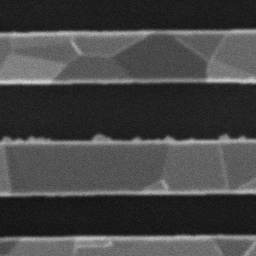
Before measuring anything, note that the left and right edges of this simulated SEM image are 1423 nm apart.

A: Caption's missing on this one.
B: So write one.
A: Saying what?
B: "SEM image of lines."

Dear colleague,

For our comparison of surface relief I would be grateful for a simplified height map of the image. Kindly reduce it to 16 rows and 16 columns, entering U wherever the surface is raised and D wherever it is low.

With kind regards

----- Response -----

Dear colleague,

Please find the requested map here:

DDDDDDDDDDDDDDDD
DDDDDDDDDDDDDDDD
UUUUUUUUUUUUUUUU
UUUUUUUUUUUUUUUU
UUUUUUUUUUUUUUUU
DDDDDDDDDDDDDDDD
DDDDDDDDDDDDDDDD
DDDDDDDDDDDDDDDD
DDDDDDDDDDDDDDDD
UUUUUUUUUUUUUUUU
UUUUUUUUUUUUUUUU
UUUUUUUUUUUUUUUU
DDDDDDDDDDDDDDDD
DDDDDDDDDDDDDDDD
DDDDDDDDDDDDDDDD
UUUUUUUUUUUUUUUU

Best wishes